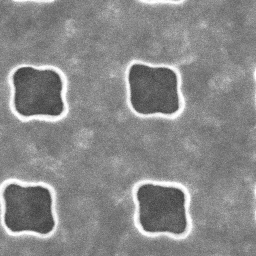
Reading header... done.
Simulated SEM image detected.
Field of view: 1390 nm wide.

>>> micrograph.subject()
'holes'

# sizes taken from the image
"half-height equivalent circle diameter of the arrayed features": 297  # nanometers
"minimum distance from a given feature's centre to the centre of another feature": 116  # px